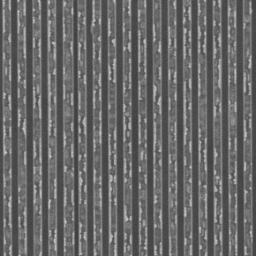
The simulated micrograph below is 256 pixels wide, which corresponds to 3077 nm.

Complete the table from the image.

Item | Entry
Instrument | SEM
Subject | parallel lines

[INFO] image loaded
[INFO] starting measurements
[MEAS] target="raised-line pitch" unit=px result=15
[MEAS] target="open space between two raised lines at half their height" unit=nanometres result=82.7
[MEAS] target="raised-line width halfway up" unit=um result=0.0932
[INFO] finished